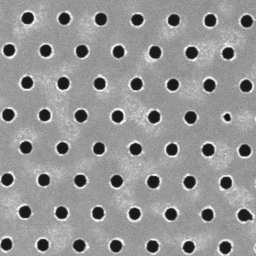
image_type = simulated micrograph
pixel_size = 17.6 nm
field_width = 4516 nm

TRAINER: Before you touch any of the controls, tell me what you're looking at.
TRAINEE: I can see a regular array of holes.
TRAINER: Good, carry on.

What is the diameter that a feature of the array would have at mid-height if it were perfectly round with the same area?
12.9 pixels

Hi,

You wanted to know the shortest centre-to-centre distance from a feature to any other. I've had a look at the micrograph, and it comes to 644 nm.